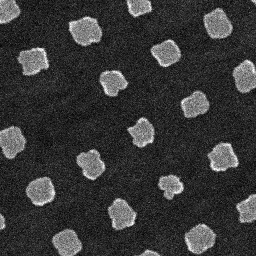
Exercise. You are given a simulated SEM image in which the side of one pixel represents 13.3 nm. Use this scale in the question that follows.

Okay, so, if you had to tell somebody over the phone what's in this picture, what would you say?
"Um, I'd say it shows a regular array of raised bodies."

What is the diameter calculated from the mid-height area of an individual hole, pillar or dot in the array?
358 nanometers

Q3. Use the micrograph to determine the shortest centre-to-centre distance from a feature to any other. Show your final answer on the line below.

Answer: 776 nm